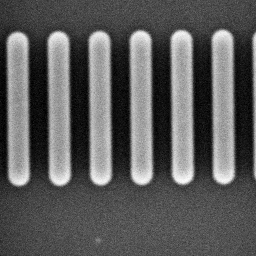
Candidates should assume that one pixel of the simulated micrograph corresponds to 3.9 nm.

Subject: groups of lines, slits or small figures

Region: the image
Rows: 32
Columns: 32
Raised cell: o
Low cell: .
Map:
................................
................................
................................
................................
.oo...oo....o....oo...oo...oo...
.oo...ooo..ooo..ooo..ooo...oo...
.oo...ooo..ooo..ooo..ooo...oo...
.oo...ooo..ooo..ooo...oo...oo...
.oo...ooo..ooo..ooo...oo...oo...
.oo...ooo..ooo..ooo...oo...oo...
.oo...ooo..ooo..ooo...oo...oo...
.oo...ooo..ooo..ooo...oo...oo...
.ooo..ooo..ooo..ooo...oo...oo...
.ooo..ooo..ooo..ooo...oo...oo...
.ooo..ooo..ooo..ooo...oo...oo...
.ooo..ooo..ooo...oo...oo...oo...
.ooo..ooo..ooo...oo...oo...oo...
.ooo..ooo..ooo...oo...oo...oo...
.ooo..ooo..ooo...oo...oo...oo...
.ooo..ooo..ooo...oo...oo...oo...
.ooo..ooo..ooo...oo...oo...oo...
.ooo..ooo..ooo...oo...oo...oo...
.oo....o....oo...oo...oo...oo...
................................
................................
................................
................................
................................
................................
................................
................................
................................